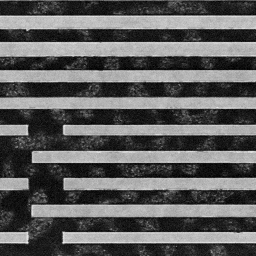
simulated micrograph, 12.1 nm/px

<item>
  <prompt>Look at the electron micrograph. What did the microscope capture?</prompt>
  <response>parallel lines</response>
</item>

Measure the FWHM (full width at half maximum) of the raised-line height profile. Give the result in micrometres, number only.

0.134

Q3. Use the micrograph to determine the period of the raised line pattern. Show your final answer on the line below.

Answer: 325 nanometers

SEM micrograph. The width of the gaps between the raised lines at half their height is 187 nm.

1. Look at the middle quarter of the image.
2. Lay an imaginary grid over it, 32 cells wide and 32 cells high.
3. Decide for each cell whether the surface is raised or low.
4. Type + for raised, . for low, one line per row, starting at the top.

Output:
................................
................................
++++++++++++++++++++++++++++++++
++++++++++++++++++++++++++++++++
................................
................................
................................
................................
................................
++++++++++++++++++++++++++++++++
++++++++++++++++++++++++++++++++
................................
................................
................................
................................
++++++++++++++++++++++++++++++++
++++++++++++++++++++++++++++++++
++++++++++++++++++++++++++++++++
................................
................................
................................
................................
++++++++++++++++++++++++++++++++
++++++++++++++++++++++++++++++++
++++++++++++++++++++++++++++++++
................................
................................
................................
................................
++++++++++++++++++++++++++++++++
++++++++++++++++++++++++++++++++
................................